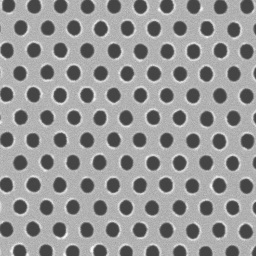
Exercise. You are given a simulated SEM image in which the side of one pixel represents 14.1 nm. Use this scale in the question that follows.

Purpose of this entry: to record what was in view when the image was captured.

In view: a regular array of holes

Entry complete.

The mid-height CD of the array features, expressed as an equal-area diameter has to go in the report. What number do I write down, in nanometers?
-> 207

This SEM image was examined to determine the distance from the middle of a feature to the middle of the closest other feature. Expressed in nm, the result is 360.